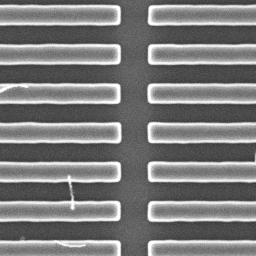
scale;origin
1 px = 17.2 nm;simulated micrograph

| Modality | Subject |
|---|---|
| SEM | groups of lines, slits or small figures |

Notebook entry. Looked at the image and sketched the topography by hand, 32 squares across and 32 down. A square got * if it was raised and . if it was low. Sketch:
................................
***************....*************
***************....*************
................................
................................
................................
***************....*************
***************....*************
................................
................................
................................
***************....*************
***************....*************
................................
................................
..***.....*****....****.**...***
***************....*************
***************....*************
................................
................................
***.***********....*************
***************....*************
***************....*************
................................
................................
***************....*************
***************....*************
*******.***........***.**..**.**
................................
................................
***************....*************
***************....*************